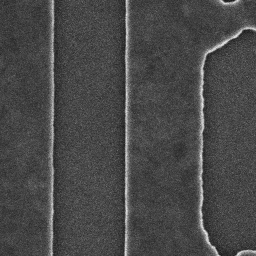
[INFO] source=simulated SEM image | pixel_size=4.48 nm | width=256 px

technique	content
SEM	one or a few lines or trenches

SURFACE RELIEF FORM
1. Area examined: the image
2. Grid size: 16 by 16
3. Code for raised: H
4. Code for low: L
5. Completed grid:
HHHLLLLLHHHHHHHH
HHHLLLLLHHHHHHHH
HHHLLLLLHHHHHHLL
HHHLLLLLHHHHHLLL
HHHLLLLLHHHHHLLL
HHHLLLLLHHHHHLLL
HHHLLLLLHHHHHLLL
HHHLLLLLHHHHHLLL
HHHLLLLLHHHHHLLL
HHHLLLLLHHHHHLLL
HHHLLLLLHHHHHLLL
HHHLLLLLHHHHHLLL
HHHLLLLLHHHHHLLL
HHHLLLLLHHHHHLLL
HHHLLLLLHHHHHLLL
HHHLLLLLHHHHHLLL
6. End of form